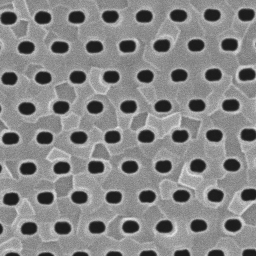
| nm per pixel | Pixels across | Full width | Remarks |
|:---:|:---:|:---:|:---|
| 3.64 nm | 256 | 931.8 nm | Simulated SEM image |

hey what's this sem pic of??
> a regular array of holes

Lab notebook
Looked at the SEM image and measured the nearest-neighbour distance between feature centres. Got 0.122 microns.